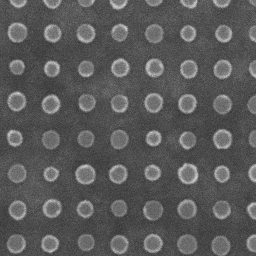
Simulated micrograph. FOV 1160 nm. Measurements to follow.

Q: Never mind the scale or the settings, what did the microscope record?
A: a regular array of raised bodies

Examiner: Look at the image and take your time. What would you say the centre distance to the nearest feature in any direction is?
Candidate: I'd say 153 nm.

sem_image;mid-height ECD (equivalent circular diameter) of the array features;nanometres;79.8